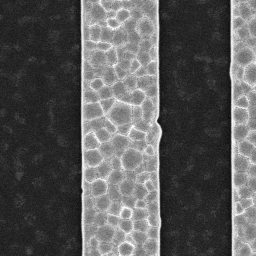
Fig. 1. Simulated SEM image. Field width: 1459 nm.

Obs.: one or a few lines or trenches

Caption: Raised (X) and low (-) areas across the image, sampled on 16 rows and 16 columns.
-----XXXXX-----X
-----XXXXX-----X
-----XXXXX-----X
-----XXXXX-----X
-----XXXXX----XX
-----XXXXX-----X
-----XXXXX-----X
-----XXXXX-----X
-----XXXXX-----X
-----XXXXX-----X
-----XXXXX-----X
-----XXXXX-----X
-----XXXXX-----X
-----XXXXX-----X
-----XXXXX-----X
-----XXXXX-----X